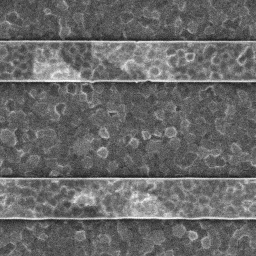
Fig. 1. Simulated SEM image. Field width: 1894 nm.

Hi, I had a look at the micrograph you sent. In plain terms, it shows one or a few lines or trenches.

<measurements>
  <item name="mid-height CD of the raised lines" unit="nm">295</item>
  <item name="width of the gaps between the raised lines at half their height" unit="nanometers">720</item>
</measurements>